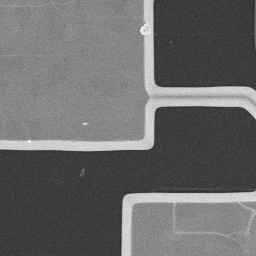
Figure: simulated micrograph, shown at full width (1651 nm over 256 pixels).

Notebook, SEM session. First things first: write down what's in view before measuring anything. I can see wiring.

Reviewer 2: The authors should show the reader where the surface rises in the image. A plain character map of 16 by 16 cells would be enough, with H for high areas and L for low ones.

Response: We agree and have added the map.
HHHHHHHHHLLLLLLL
HHHHHHHHHLLLLLLL
HHHHHHHHHLLLLLLL
HHHHHHHHHLLLLLLL
HHHHHHHHHLLLLLLL
HHHHHHHHHHLLLLLL
HHHHHHHHHHLLLLLH
HHHHHHHHHLLLLLLL
HHHHHHHHHLLLLLLL
LLLLLLLLLLLLLLLL
LLLLLLLLLLLLLLLL
LLLLLLLLLLLLLLLL
LLLLLLLLHHHHHHHH
LLLLLLLLHHHHHHHH
LLLLLLLLHHHHHHHH
LLLLLLLLHHHHHHHH